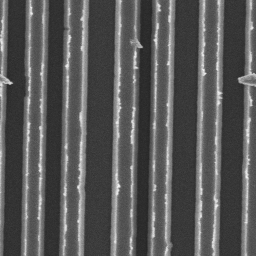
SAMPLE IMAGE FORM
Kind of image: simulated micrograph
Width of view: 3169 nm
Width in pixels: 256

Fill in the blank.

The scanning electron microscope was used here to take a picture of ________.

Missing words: parallel lines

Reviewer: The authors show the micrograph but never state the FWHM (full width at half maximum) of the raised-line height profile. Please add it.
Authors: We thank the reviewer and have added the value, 18.5 pixels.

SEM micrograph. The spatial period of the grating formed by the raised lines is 540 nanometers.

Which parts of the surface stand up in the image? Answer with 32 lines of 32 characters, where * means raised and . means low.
*...**..***....**..***...***...*
*...**..***....**..***...***...*
*...**..***....**..**....***...*
*...**..***....**..**....***...*
*..***..***....**..**....***...*
*..***..***....***.**....***...*
*..***..***....**..**....***...*
*..***..***....**..**....**....*
...**...***....**..**....**....*
*...*...***....**..**....**....*
*..***..***....**..**....**...**
...**...**.....**..**....***...*
...**...**.....**..**....***...*
...***..**.....**..**....**....*
...**...**.....**..**....**....*
...**...**.....**..**....**....*
...**...**....***..**....**....*
...**...**....***..**....**....*
...**...**....***..**....**....*
...**...**....***..**....**....*
...**...**....***..**....**....*
...**...**....***..**....**....*
...**...**....***..**....**....*
...**...**....***..**....**....*
...**...**....***..**....**....*
...**...**....***..**....**....*
...**...**....***..**....**....*
...**...**....***..**....**....*
...**...**....***..**....**....*
...**...**....***..**....**....*
...**...**....***..**....**....*
...**...**....***..**....**....*